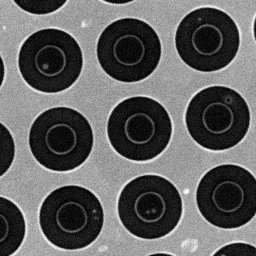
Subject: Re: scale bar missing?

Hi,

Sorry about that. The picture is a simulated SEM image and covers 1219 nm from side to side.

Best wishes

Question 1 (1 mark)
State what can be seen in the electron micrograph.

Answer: an array of small figures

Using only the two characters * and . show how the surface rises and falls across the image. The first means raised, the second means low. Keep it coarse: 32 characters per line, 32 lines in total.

**......******.*****************
***....*****************....****
***************...*****......***
*************......***...**...**
****.....***....*...**..****..**
***.......**..****..**..****..**
**...***..**..****..**...**...**
**..****..**...***..***......***
.*...***..***.......****....****
.**.......****.....*************
***......***********************
*****..******************.....**
***************....*****.......*
*******..*****.......**...**...*
*****.....****...*...**..****..*
****.......**...***..**...***..*
.***..***...*...***..***...*...*
..**..***...**..***..***......**
..**..***...**.......*****...***
..**.......****.....************
.****.....**********************
.*************************.....*
****************.....****.......
*******....****.......***..***..
******......***...**...**..***..
..***...**...**..***...**..***..
...**..****..**..***...**.......
*..**..****..**...**...***.....*
*..**...**...***......******..**
*..***......*****....***********
...***.....******************..*
..*************************.....